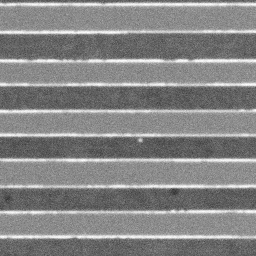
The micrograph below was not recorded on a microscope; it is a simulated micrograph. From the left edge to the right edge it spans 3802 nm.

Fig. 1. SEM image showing lines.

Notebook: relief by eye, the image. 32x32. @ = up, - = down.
--------------------------------
@@@@@@@@@@@@@@@@@@@@@@@@@@@@@@@@
@@@@@@@@@@@@@@@@@@@@@@@@@@@@@@@@
@@@@@@@@@@@@@@@@@@@@@@@@@@@@@@@@
--------------------------------
--------------------------------
--------------------------------
--------------------------------
@@@@@@@@@@@@@@@@@@@@@@@@@@@@@@@@
@@@@@@@@@@@@@@@@@@@@@@@@@@@@@@@@
@@@@@@@@@@@@@@@@@@@@@@@@@@@@@@@@
--------------------------------
--------------------------------
--------------------------------
@@@@@@@@@@@@@@@@@@@@@@@@@@@@@@@@
@@@@@@@@@@@@@@@@@@@@@@@@@@@@@@@@
@@@@@@@@@@@@@@@@@@@@@@@@@@@@@@@@
--------------------------------
--------------------------------
--------------------------------
@@@@@@@@@@@@@@@@@@@@@@@@@@@@@@@@
@@@@@@@@@@@@@@@@@@@@@@@@@@@@@@@@
@@@@@@@@@@@@@@@@@@@@@@@@@@@@@@@@
--------------------------------
--------------------------------
--------------------------------
---------------------@@@@@@@@@@@
@@@@@@@@@@@@@@@@@@@@@@@@@@@@@@@@
@@@@@@@@@@@@@@@@@@@@@@@@@@@@@@@@
@@@@@@@@@@@@@@@@@@@@@@@@@@@@@@@@
--------------------------------
--------------------------------